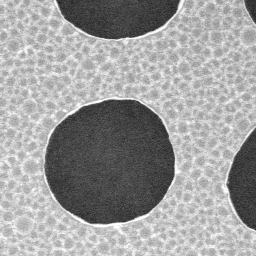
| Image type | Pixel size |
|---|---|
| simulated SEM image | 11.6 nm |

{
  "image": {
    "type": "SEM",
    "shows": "holes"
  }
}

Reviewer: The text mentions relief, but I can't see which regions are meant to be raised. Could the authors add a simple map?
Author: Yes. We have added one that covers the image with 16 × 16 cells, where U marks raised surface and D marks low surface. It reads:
UUUUDDDDDDDUUUUD
UUUUDDDDDDUUUUUU
UUUUUUUUUUUUUUUU
UUUUUUUUUUUUUUUU
UUUUUUUUUUUUUUUU
UUUUUUUUUUUUUUUU
UUUUUUDDDUUUUUUU
UUUUDDDDDDUUUUUU
UUUDDDDDDDDUUUUU
UUUDDDDDDDDUUUUD
UUUDDDDDDDDUUUDD
UUUDDDDDDDDUUUDD
UUUUDDDDDDUUUUDD
UUUUUDDDDUUUUUUD
UUUUUUUUUUUUUUUU
UUUUUUUUUUUUUUUU